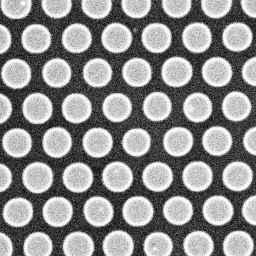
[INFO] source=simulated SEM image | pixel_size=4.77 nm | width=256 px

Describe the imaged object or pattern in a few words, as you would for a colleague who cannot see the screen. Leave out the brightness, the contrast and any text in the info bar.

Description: an array of small figures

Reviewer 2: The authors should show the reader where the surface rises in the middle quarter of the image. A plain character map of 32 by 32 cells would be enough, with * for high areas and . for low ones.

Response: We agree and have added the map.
*....******....******....*******
**...*******...*******...*******
**...*******...*******...*******
**...*******...******....******.
*.....*****.....*****....******.
...........................**...
................................
......................***.......
.*****.....*****.....*****.....*
******....******....******....**
*******...*******...*******...**
*******...*******...*******...**
******....******....******....**
.*****.....****......****......*
..**............................
................................
.......***.......***.......****.
*....******....******.....******
**...*******...******....*******
**...*******...******....*******
**...*******...******....*******
*....******.....*****.....*****.
......****.......***.......***..
................................
................................
.*****.....*****.....*****.....*
******....*******...*******...**
*******...*******...*******...**
*******...*******...*******...**
*******...*******...*******...**
.*****.....*****.....*****.....*
..***.......***.......***.......